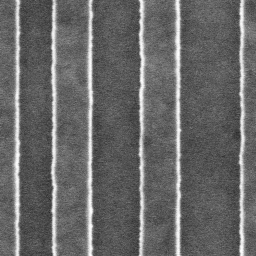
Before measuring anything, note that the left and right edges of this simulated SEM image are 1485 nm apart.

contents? lines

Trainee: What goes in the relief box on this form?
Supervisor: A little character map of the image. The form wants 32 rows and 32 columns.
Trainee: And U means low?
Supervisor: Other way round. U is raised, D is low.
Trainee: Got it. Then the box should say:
UUDDDDDUUUUDDDDDDDUUUUDDDDDDDDUU
UUDDDDDUUUUDDDDDDDUUUUDDDDDDDDUU
UUDDDDDUUUUDDDDDDDUUUUDDDDDDDDUU
UUDDDDDUUUUDDDDDDDUUUUDDDDDDDDUU
UUDDDDDUUUUDDDDDDDUUUUDDDDDDDDUU
UUDDDDDUUUUDDDDDDDUUUUDDDDDDDDUU
UUDDDDDUUUUDDDDDDDUUUUDDDDDDDDUU
UUDDDDDUUUUDDDDDDDUUUUDDDDDDDDUU
UUDDDDDUUUUDDDDDDDUUUUDDDDDDDDUU
UUDDDDDUUUUDDDDDDDUUUUDDDDDDDDUU
UUDDDDDUUUUDDDDDDDUUUUDDDDDDDDUU
UUDDDDDUUUUDDDDDDDUUUUDDDDDDDDUU
UUDDDDDUUUUDDDDDDDUUUUDDDDDDDDUU
UUDDDDDUUUUDDDDDDDUUUUDDDDDDDDUU
UUDDDDDUUUUDDDDDDDUUUUDDDDDDDDUU
UUDDDDDUUUUDDDDDDDUUUUDDDDDDDDUU
UUDDDDDUUUUDDDDDDDUUUUDDDDDDDDUU
UUDDDDDUUUUDDDDDDDUUUUDDDDDDDDUU
UUDDDDDUUUUDDDDDDDUUUUDDDDDDDDUU
UUDDDDDUUUUDDDDDDUUUUUDDDDDDDDUU
UUDDDDDUUUUDDDDDDDUUUUDDDDDDDDUU
UUDDDDDUUUUDDDDDDDUUUUDDDDDDDDUU
UUDDDDDUUUUDDDDDDDUUUUDDDDDDDDUU
UUDDDDDUUUUDDDDDDDUUUUDDDDDDDDUU
UUDDDDDUUUUDDDDDDDUUUUDDDDDDDDUU
UUDDDDDUUUUDDDDDDDUUUUDDDDDDDDUU
UUDDDDDUUUUDDDDDDDUUUUDDDDDDDDUU
UUDDDDDUUUUDDDDDDDUUUUDDDDDDDDUU
UUDDDDDUUUUDDDDDDDUUUUDDDDDDDDUU
UUDDDDDUUUUDDDDDDDUUUUDDDDDDDDUU
UUDDDDDUUUUDDDDDDDUUUUDDDDDDDDUU
UUDDDDDUUUUDDDDDDDUUUUDDDDDDDDUU